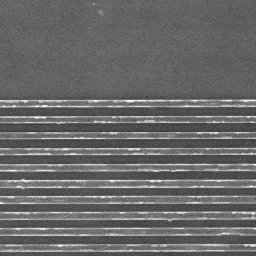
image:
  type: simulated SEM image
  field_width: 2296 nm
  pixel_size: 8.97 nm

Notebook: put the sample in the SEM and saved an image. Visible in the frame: parallel lines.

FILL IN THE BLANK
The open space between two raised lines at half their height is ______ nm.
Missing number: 84.1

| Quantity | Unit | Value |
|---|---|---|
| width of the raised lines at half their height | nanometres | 59.4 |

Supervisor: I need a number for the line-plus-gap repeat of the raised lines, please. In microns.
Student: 0.144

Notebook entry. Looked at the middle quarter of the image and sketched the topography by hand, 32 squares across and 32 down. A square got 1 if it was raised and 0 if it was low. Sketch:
00000000000000000000000000000000
00000000000000000000000000000000
00000000000000000000000000000000
00000000000000000000000000000000
00000000000000000000000000000000
00000000000000000000000000000000
00000000000000000000000000000000
00000000000000000000000000000000
00000000000000000000000000000000
11111111111111111111111111111111
11111111111111111111111111111111
00000000000000000000000000000000
00000000000000000000000000000000
11111111111111111111111111111111
11111111111111111111111111111111
00000000000000000000000000000000
00000000000000000000000000000000
11111111111111111111111111111111
11111111111111111111111111111111
00000000000000000000000000000000
00000000000000000000000000000000
11111111111111111111111111111111
11111111111111111111111111111111
00000000000000000000000000000000
00000000000000000000000000000000
11111111111111111111111111111111
11111111111111111111111111111111
00000000000000000000000000000000
00000000000000000000000000000000
11111111111111111111111111111111
11111111111111111111111111111111
00000000000000000000000000000000